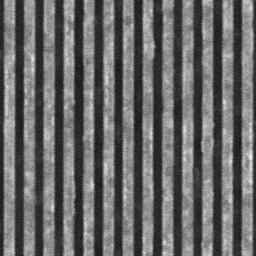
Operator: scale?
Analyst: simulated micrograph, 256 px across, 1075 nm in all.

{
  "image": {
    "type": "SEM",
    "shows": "parallel lines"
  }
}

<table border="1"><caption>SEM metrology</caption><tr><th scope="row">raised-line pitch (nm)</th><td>83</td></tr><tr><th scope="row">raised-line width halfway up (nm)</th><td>42.5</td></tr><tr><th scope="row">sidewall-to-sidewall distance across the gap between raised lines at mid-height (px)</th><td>10.1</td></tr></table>